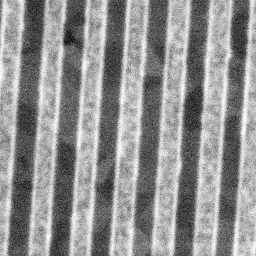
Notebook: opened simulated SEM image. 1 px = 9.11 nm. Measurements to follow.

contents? parallel lines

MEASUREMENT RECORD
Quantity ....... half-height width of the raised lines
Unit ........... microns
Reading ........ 0.216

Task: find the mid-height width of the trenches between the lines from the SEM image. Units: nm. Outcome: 158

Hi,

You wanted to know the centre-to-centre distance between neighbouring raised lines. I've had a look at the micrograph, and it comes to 375 nm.